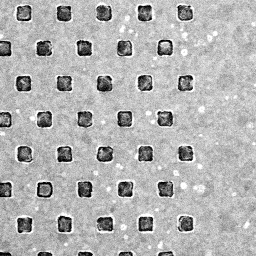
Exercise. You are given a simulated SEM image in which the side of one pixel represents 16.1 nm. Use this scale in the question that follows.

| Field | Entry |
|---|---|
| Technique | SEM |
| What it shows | a regular array of holes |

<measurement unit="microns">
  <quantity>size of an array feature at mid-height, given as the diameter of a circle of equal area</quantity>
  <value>0.278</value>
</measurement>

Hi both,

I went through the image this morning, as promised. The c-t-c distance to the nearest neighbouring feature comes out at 645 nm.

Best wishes